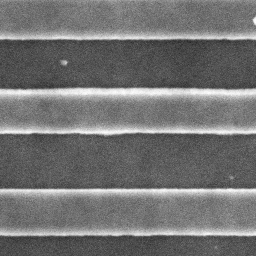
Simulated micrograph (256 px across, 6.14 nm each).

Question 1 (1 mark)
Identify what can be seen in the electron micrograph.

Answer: lines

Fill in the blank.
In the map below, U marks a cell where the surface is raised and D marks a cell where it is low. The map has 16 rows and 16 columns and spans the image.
UUUUUUUUUUUUUUUU
UUUUUUUUUUUUUUUU
DDDDDDDDDDDDDDDD
DDDDDDDDDDDDDDDD
DDDDDDDDDDDDDDDD
DDDDDDDDDDDDDDDD
UUUUUUUUUUUUUUUU
UUUUUUUUUUUUUUUU
DDDDDDDDDDDDDDDD
DDDDDDDDDDDDDDDD
DDDDDDDDDDDDDDDD
DDDDDDDDDDDDDDDD
UUUUUUUUUUUUUUUU
UUUUUUUUUUUUUUUU
UUUUUUUUUUUUUUUU
DDDDDDDDDDDDDDDD